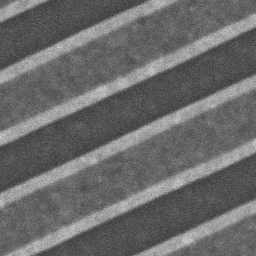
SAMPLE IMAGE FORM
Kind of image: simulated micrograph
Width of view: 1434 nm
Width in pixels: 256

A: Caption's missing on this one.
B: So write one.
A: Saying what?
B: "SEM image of one or a few lines or trenches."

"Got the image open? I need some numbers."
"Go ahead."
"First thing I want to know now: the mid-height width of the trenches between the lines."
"305 nanometers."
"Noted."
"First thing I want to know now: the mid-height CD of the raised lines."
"327 nm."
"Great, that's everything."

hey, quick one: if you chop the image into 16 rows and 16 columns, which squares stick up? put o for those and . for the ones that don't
o........ooooooo
.......ooooooooo
.....oooooooo...
...oooooooo.....
.oooooooo.......
ooooooo........o
ooooo........ooo
ooo........ooooo
.........ooooooo
.......oooooooo.
....ooooooooo...
..ooooooooo.....
ooooooooo.......
oooooo.........o
oooo........oooo
oo........oooooo